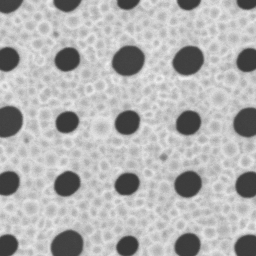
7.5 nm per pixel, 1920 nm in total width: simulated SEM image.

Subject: a regular array of holes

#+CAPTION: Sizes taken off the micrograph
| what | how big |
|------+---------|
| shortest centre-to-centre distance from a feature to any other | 452 nanometres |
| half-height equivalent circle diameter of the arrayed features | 185 nm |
